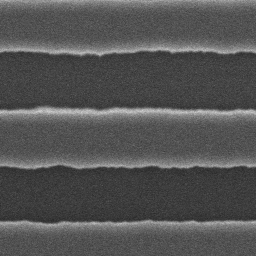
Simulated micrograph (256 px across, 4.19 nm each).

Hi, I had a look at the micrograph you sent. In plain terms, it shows lines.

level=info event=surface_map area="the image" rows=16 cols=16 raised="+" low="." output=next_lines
++++++++++++++++
++++++++++++++++
++++++++++++++++
................
................
................
................
++++++++++++++++
++++++++++++++++
++++++++++++++++
................
................
................
................
++++++++++++++++
++++++++++++++++